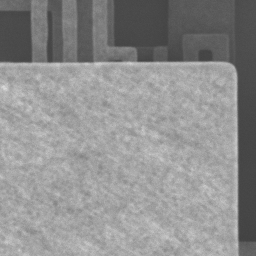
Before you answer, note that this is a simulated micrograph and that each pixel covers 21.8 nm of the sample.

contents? wiring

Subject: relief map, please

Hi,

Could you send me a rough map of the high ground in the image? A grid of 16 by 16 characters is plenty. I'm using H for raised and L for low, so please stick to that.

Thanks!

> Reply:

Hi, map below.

LLLLLLLLLLLLLLLL
LLLLLLLLLLLLLLLL
LLLLLLLLLLLLLLLL
LLLLLLLLLLLLLLLL
HHHHHHHHHHHHHHHL
HHHHHHHHHHHHHHHL
HHHHHHHHHHHHHHHL
HHHHHHHHHHHHHHHL
HHHHHHHHHHHHHHHL
HHHHHHHHHHHHHHHL
HHHHHHHHHHHHHHHL
HHHHHHHHHHHHHHHL
HHHHHHHHHHHHHHHL
HHHHHHHHHHHHHHHL
HHHHHHHHHHHHHHHL
HHHHHHHHHHHHHHHL